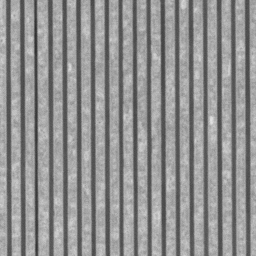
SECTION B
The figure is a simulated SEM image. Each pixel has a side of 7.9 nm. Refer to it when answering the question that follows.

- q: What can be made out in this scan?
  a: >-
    parallel lines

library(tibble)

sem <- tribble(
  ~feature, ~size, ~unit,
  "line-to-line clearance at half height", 37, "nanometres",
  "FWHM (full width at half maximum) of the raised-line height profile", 9.38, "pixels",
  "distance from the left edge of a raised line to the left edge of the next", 111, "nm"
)